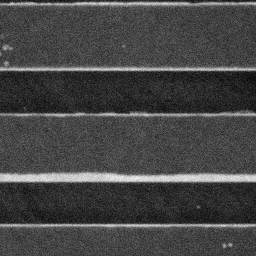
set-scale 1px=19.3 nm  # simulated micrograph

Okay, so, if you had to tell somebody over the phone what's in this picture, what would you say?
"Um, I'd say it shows lines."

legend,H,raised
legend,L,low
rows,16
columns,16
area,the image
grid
HHHHHHHHHHHHHHHH
HHHHHHHHHHHHHHHH
HHHHHHHHHHHHHHHH
HHHHHHHHHHHHHHHH
LLLLLLLLLLLLLLLL
LLLLLLLLLLLLLLLL
LLLLLLLLLLLLLLLL
HHHHHHHHHHHHHHHH
HHHHHHHHHHHHHHHH
HHHHHHHHHHHHHHHH
HHHHHHHHHHHHHHHH
LLLLLLLLLLLLLLLL
LLLLLLLLLLLLLLLL
LLLLLLLLLLLLLLLL
HHHHHHHHHHHHHHHH
HHHHHHHHHHHHHHHH